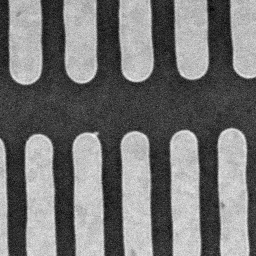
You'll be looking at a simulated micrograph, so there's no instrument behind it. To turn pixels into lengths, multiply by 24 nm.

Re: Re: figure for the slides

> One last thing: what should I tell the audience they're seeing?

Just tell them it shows groups of lines, slits or small figures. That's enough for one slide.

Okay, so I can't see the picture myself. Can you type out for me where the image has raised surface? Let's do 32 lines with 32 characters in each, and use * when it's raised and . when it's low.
.****...****...****...****...***
.****...****...****...****...***
.****...****...****...****...***
.****...****...****...****...***
.****...****...****...****...***
.****...****...****...****...***
.****...****...****...****...***
.****...****...****...****...***
.****...****...****...****...***
..***....***....***....**.....**
................................
................................
................................
................................
................................
................................
......................**....**..
....**...***...***....***..****.
*..***...****..****..****..****.
*..***...****..****..****..****.
*..***...****..****..****..****.
*..***...****..****...***..****.
*..****..****..****...***..****.
*..****..****..****...***..****.
*..****..****..****...***..****.
*...***..****..****...***...***.
*...***..****..****...***...***.
*..****..****..****...***...***.
*..****..****...***...***...***.
*..****...***...***...***...***.
*..****...***...***...***...***.
*..****...***...***...***...***.